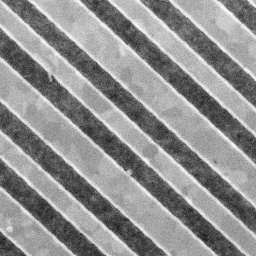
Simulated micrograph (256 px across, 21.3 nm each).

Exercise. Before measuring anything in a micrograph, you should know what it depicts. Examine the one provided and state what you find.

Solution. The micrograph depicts lines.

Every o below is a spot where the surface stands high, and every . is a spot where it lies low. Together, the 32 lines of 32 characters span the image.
....oooooo....oooo....oooooo....
oo...oooooo....oooo....oooooo...
ooo...oooooo....oooo....oooooo..
oooo...oooooo....oooo....oooooo.
.oooo....oooooo...oooo....oooooo
..oooo....oooooo...oooo....ooooo
...oooo....oooooo....ooo....oooo
.....ooo....oooooo....ooo....ooo
o.....ooo....oooooo....ooo....oo
ooo...oooo....oooooo....oooo...o
oooo....ooo....oooooo....oooo...
ooooo....ooo....oooooo....oooo..
oooooo....oooo...oooooo....oooo.
.oooooo....oooo...oooooo....oooo
..oooooo....oooo...oooooo....ooo
...oooooo....oooo....ooooo....oo
....oooooo....oooo....oooooo...o
o....oooooo....oooo....oooooo...
oo.....ooooo....oooo....oooooo..
ooo.....ooooo....oooo....oooooo.
.oooo....oooooo....ooo....oooooo
..oooo....oooooo....ooo....ooooo
...oooo....oooooo....ooo....oooo
....oooo....oooooo....ooo....ooo
o....oooo....oooooo....oooo....o
oo....oooo....oooooo....oooo....
ooo....oooo....oooooo....oooo...
ooooo....ooo....oooooo....oooo..
oooooo....ooo....oooooo....oooo.
.oooooo....ooo....oooooo....oooo
..oooooo....oooo....oooooo...ooo
...oooooo....oooo....oooooo...oo